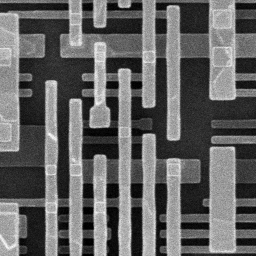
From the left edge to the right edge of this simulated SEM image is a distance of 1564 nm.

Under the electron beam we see wiring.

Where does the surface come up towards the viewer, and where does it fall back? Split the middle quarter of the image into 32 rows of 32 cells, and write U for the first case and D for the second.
DDDDDDDDUUDDDDDDDDDDUUUDDDUUUDDD
DDDDDDDDUUDDDDUUDDDDUUUDDDUUUDDD
DDDDDDDDUUDDDDUUUDDDUUUDDDUUUDDD
DDDDDDDDUUDDDDUUUDDDUUUDDDUUUDDD
DDDDDDDDUUDDDDUUDDDDUUUDDDUUUDDD
DDDDDDDDUUDDDDUUUDDDUUUDDDUUUDDD
DDDDDDDDUUDDDDUUUDDDUUUDDDUUUDDD
DDDDDDDDUUDDDDUUUDDDUUUDDDUUUDDD
DDDDDDDDUUDDDDUUUDDDUUUDDDUUUDDD
DDUUDDDDUUDDDDUUUDDDUUUDDDUUUDDD
DDUUDDDUUUUDDDUUUDDDUUDDDDUUUDDD
DDUUDDDUUUUDDDUUUDDDDDDDDDUUUDDD
DDUUDDDUUUUDDDUUUDDDDDDDDDUUUDDD
DDUUDDDUUUUDDDUUUDDDDDDDDDUUUDDD
DDUUDDUUUUUDDDUUUDDDDDDDDDUUUDDD
DDUUDDDUUUUDDDUUUDDDDDDDDDUUUDDD
DDUUDDDDDDDDDDUUUDDDDDDDDDUUUDDD
DUUUDDDDDDDDDDUUUDDDUUDDDDUUUDDD
DUUUDDDDDDDDDDUUUDDDUUUDDDUUUDDD
DUUUDDDDDDDDDDUUUDDDUUUDDDDDDDDD
DUUUDDDDDDDDDDUUUDDDUUUDDDDDDDDD
DUUUDDDDDDDDDDUUUDDDUUUDDDDDDDDD
DDUUDDDDDDDDDDUUUDDDUUUDDDDDDDDD
DDUUDDDDUUUDDDUUUDDDUUUDDDDDDDDD
DDUUDDDDUUUDDDUUUDDDUUUDDDUUUDDD
DDUUDDDDUUUDDDUUUDDDUUUDDDUUUDDD
DDUUDDDDUUUDDDUUUDDDUUUDDDUUUDDD
DDUUDDDDUUUDDDUUDDDDUUUDDDUUUDDD
DDUUDDDDUUUDDDUUUDDDUUUDDDUUUDDD
DDUUDDDUUUUDDDUUUDDDUUUDDDUUUDDD
DDUUDDDUUUUDDDUUDDDDUUUDDDUUUDDD
DDUUDDDDUUUDDDUUDDDDUUDDDDUUUDDD